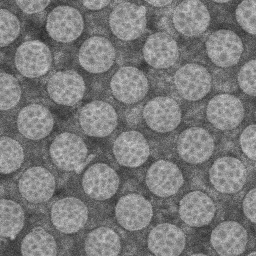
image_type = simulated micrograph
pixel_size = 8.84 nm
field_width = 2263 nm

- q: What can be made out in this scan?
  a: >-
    a regular array of raised bodies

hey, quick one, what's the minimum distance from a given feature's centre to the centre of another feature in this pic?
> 391 nm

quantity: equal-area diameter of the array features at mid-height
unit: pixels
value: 35.8